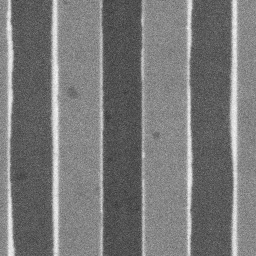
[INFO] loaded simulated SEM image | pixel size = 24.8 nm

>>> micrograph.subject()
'lines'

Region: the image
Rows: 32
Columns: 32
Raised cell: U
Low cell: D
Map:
UDDDDDDUUUUUUDDDDDUUUUUUDDDDDUUU
UDDDDDDUUUUUUDDDDDUUUUUUDDDDDUUU
UDDDDDDUUUUUUDDDDDUUUUUUDDDDDUUU
UDDDDDDUUUUUUDDDDDUUUUUUDDDDDUUU
UDDDDDDUUUUUUDDDDDUUUUUUDDDDDUUU
UDDDDDDUUUUUUDDDDDUUUUUUDDDDDUUU
UDDDDDDUUUUUUDDDDDUUUUUUDDDDDUUU
UDDDDDDUUUUUUDDDDDUUUUUDDDDDDUUU
UDDDDDDUUUUUUDDDDDUUUUUDDDDDDUUU
UDDDDDDUUUUUUDDDDDUUUUUDDDDDDUUU
UDDDDDDUUUUUUDDDDDUUUUUDDDDDDUUU
UDDDDDDUUUUUUDDDDDUUUUUUDDDDDUUU
UDDDDDDUUUUUUDDDDDUUUUUUDDDDDUUU
UDDDDDDUUUUUUDDDDDUUUUUUDDDDDUUU
UDDDDDDUUUUUUDDDDDUUUUUUDDDDDUUU
UDDDDDDUUUUUUDDDDDUUUUUUDDDDDUUU
UDDDDDDUUUUUUDDDDDUUUUUUDDDDDUUU
UDDDDDDUUUUUUDDDDDUUUUUUDDDDDUUU
UDDDDDDUUUUUUDDDDDUUUUUUDDDDDUUU
UDDDDDDUUUUUUDDDDDUUUUUUDDDDDUUU
UDDDDDDUUUUUUDDDDDUUUUUUDDDDDDUU
UDDDDDDUUUUUUDDDDDUUUUUUDDDDDDUU
UDDDDDDUUUUUUDDDDDUUUUUUDDDDDDUU
UDDDDDDUUUUUUDDDDDUUUUUUDDDDDDUU
UDDDDDDUUUUUUDDDDDUUUUUUDDDDDDUU
UDDDDDDUUUUUUDDDDDUUUUUUDDDDDDUU
UDDDDDDUUUUUUDDDDDUUUUUUDDDDDDUU
UDDDDDDUUUUUUDDDDDUUUUUUDDDDDDUU
UDDDDDDUUUUUUDDDDDUUUUUUDDDDDDUU
UDDDDDDUUUUUUDDDDDUUUUUUDDDDDUUU
UDDDDDDUUUUUUDDDDDUUUUUUDDDDDDUU
UDDDDDDUUUUUUDDDDDUUUUUUDDDDDDUU